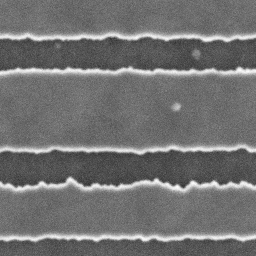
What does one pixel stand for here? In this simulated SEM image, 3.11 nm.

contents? lines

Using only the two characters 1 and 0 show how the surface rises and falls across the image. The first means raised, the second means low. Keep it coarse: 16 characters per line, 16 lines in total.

1111111111111111
1111111111111111
0000000000000000
0000000000000000
1111111111111111
1111111111111111
1111111111111111
1111111111111111
1111111111111111
0010000010000000
0000000000000000
0000100011001101
1111111111111111
1111111111111111
1111111111111111
0000000000000000